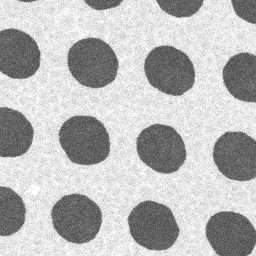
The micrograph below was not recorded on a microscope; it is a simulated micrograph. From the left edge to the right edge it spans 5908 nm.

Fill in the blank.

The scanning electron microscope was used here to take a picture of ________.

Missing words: holes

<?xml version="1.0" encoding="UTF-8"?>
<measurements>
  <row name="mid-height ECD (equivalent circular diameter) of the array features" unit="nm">1170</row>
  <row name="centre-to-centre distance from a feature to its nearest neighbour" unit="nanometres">1780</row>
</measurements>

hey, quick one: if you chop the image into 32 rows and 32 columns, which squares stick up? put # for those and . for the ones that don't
###########....#####.....####...
#####################....####...
##############################..
################################
....############################
.....####.....##################
.....####.....#####....#########
.....###.......###......#####...
.....####......###......####....
#...#####......###......####....
##########....#####.....####....
####################...######...
##############################..
.###############################
...######..#####################
....####.....######.############
....###......#####....######..##
....###.......###......####.....
....####......###......####.....
..######.....####......####.....
#########...######.....####.....
####################..######....
#############################..#
.###############################
...#####...#####################
...####.....#####...############
...###.......###......#####..###
...###.......###......####.....#
...####......###......####......
.#######....####......####......
#################.....####......
###########################....#